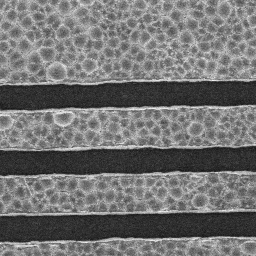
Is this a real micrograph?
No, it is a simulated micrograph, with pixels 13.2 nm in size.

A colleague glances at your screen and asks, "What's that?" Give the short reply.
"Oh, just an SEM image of one or a few lines or trenches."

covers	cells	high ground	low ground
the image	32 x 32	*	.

********************************
********************************
********************************
********************************
********************************
********************************
********************************
********************************
********************************
********************************
***........*....................
................................
................................
..................*...**********
********************************
********************************
********************************
********************************
************....................
................................
................................
................................
********************************
********************************
********************************
********************************
*****************.***...........
................................
................................
................................
********************************
********************************